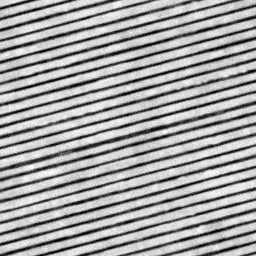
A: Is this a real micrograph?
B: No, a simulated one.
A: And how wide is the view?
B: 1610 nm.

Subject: parallel lines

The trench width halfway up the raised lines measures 25.8 nm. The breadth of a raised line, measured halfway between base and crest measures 41.8 nm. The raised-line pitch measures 65.4 nanometers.